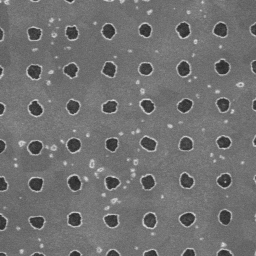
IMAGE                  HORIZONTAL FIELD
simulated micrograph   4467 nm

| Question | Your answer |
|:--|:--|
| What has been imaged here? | a regular array of holes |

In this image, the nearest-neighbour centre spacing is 641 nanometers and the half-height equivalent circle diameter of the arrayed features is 14.1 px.